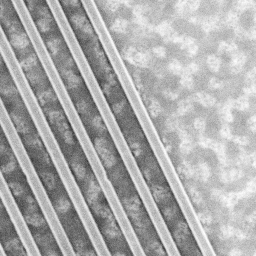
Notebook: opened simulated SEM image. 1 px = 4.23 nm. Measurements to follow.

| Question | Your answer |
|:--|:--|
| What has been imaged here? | parallel lines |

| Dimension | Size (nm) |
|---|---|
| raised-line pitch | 133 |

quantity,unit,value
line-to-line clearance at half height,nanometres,93.5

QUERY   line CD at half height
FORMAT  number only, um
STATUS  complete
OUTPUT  0.0429